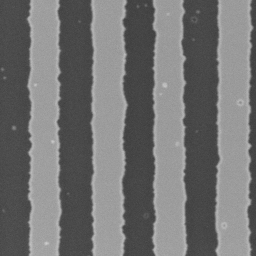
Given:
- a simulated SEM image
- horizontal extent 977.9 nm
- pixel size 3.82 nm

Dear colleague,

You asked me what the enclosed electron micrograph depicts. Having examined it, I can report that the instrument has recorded lines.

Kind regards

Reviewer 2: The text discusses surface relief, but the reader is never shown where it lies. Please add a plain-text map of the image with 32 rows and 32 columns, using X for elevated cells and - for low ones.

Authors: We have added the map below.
----XXX----XXXXX---XXXX----XXXX-
----XXX-----XXXX---XXXX----XXXX-
----XXX-----XXX----XXXX----XXXX-
----XXX----XXXXX---XXXX----XXXX-
----XXX-----XXX-----XXX----XXXX-
----XXX-----XXXX---XXXX----XXXX-
----XXX-----XXXX---XXXX----XXXX-
----XXX-----XXXX---XXXX----XXXX-
----XXX-----XXXX---XXXX----XXXX-
----XXX-----XXX----XXXX----XXXX-
----XXX-----XXX----XXXX----XXXX-
----XXX----XXXX----XXXX----XXXX-
----XXX-----XXXX---XXXX----XXXX-
----XXX----XXXXX---XXXX----XXXX-
----XXX-----XXXX---XXXX----XXXX-
----XXX----XXXXX---XXXX----XXXX-
----XXX-----XXX----XXXX----XXXX-
----XXX-----XXX----XXXX----XXXX-
----XXX-----XXX----XXXX----XXXX-
----XXX-----XXXX---XXXX----XXXX-
----XXX-----XXXX---XXXX----XXXX-
----XXX-----XXXX---XXXX----XXXX-
----XXX----XXXX----XXXX----XXXX-
----XXX-----XXX----XXXX----XXXX-
----XXX-----XXX----XXXX----XXXX-
----XXXX----XXX----XXXX----XXXX-
----XXXX----XXX----XXXX----XXXX-
----XXX-----XXX----XXXX----XXXX-
----XXX-----XXX----XXXX----XXXX-
----XXX-----XXXX---XXXX----XXXX-
----XXX-----XXX----XXXX----XXXX-
----XXX-----XXX----XXXX----XXXX-